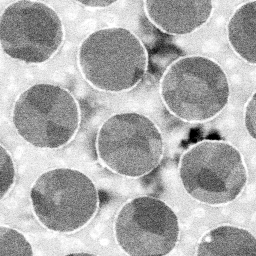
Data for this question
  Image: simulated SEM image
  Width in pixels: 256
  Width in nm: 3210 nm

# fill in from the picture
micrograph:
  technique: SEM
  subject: raised bodies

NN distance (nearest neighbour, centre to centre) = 1070 nanometres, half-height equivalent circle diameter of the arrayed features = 67.5 px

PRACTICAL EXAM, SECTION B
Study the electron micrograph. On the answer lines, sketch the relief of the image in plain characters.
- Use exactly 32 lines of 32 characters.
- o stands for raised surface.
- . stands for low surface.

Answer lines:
.ooooo....oooo....ooooooooo...oo
ooooooo...........oooooooo...ooo
oooooooo...........ooooooo...ooo
oooooooo.....oo.....ooooo...oooo
oooooooo...oooooo...........oooo
oooooooo..oooooooo...........ooo
.oooooo...oooooooo...........ooo
..oooo....oooooooo....ooooo...oo
..........oooooooo...ooooooo....
..........oooooooo..oooooooo....
.....o.....oooooo...ooooooooo...
...oooooo....oo.....ooooooooo...
..ooooooo...........ooooooooo..o
..oooooooo...........ooooooo...o
.ooooooooo....oooo....ooooo....o
..oooooooo...oooooo............o
..oooooooo..oooooooo...........o
...oooooo...oooooooo............
o....oo.....oooooooo....oooooo..
o...........oooooooo...ooooooo..
oo...........ooooooo..ooooooooo.
oo....oooo....ooooo...ooooooooo.
oo..ooooooo............oooooooo.
oo..oooooooo...........oooooooo.
o...oooooooo............oooooo..
....oooooooo....ooooo.....oo....
....oooooooo...ooooooo..........
.....oooooo...oooooooo..........
oo....oooo....oooooooo.....ooo..
ooo...........oooooooo...ooooooo
oooo...........ooooooo...ooooooo
oooo............ooooo...oooooooo